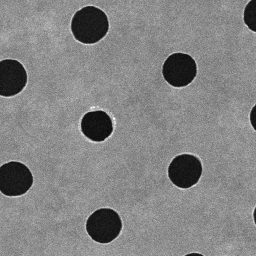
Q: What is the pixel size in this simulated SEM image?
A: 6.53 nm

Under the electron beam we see holes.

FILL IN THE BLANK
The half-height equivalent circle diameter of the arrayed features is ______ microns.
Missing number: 0.225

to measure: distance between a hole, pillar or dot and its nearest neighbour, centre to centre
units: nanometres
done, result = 647